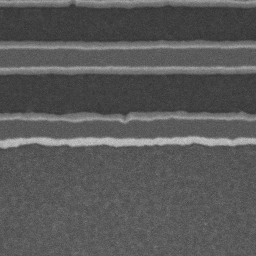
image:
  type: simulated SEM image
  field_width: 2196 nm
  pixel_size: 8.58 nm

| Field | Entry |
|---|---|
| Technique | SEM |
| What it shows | one or a few lines or trenches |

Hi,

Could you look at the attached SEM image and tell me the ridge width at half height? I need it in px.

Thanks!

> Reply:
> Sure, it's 25.7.